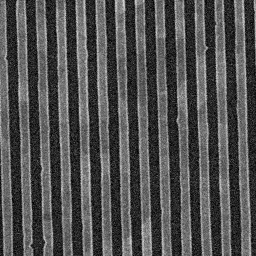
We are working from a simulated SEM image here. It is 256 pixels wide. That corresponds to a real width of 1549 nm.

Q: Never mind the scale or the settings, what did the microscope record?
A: parallel lines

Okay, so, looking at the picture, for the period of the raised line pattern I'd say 0.12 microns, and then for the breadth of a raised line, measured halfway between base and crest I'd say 51.4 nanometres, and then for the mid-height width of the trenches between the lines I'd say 68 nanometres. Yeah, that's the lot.